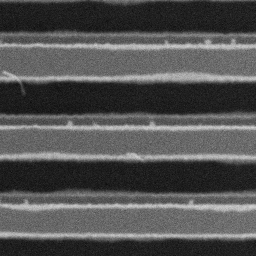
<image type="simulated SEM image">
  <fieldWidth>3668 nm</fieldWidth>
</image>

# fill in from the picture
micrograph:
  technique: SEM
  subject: lines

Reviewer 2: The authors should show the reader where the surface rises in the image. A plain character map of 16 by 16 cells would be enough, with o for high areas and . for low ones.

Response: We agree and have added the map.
................
................
oooooooooooooooo
oooooooooooooooo
oooooooooooooooo
................
................
oooooooooooooooo
oooooooooooooooo
oooooooooooooooo
................
................
oooooooooooooooo
oooooooooooooooo
oooooooooooooooo
................